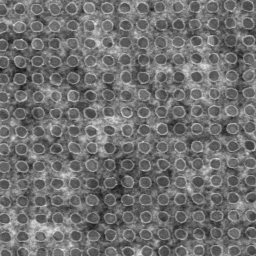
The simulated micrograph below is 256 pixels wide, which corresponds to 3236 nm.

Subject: a regular array of raised bodies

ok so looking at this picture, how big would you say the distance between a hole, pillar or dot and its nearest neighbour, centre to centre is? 17 px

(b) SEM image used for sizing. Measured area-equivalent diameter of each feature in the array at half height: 149 nm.